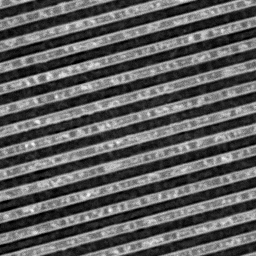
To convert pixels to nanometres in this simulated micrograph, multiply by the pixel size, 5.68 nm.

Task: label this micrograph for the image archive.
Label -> parallel lines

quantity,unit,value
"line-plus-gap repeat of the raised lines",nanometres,118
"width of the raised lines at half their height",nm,50.8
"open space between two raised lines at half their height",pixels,11.6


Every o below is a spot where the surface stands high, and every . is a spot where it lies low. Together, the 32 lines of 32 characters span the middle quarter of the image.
..oooooooo............oooooooo..
ooooooo...........ooooooooo.....
ooo...........ooooooooo.........
...........oooooooo............o
.......ooooooooo...........ooooo
...ooooooooo...........ooooooooo
oooooooo...........ooooooooo....
oooo............oooooooo........
............oooooooo............
........ooooooooo............ooo
....ooooooooo...........oooooooo
ooooooooo............ooooooooo..
ooooo.............ooooooo.......
o............ooooooooo..........
.........oooooooooo..........ooo
......ooooooooo...........oooooo
..ooooooooo............oooooooo.
ooooooo...........ooooooooo.....
ooo............ooooooooo........
...........ooooooooo...........o
........oooooooo............oooo
....oooooooo............oooooooo
ooooooooo...........ooooooooo...
ooooo...........ooooooooo.......
o...........ooooooooo...........
.........oooooooo............ooo
.....ooooooooo...........ooooooo
.ooooooooo...........ooooooooo..
oooooo............oooooooo......
oo............oooooooo..........
..........ooooooooo...........oo
......ooooooooo...........oooooo